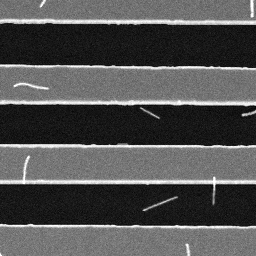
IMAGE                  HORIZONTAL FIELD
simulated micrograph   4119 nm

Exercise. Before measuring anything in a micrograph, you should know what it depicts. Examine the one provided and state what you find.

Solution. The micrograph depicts lines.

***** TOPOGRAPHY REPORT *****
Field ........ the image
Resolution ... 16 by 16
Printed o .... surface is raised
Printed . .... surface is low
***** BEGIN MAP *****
oooooooooooooooo
................
................
................
oooooooooooooooo
oooooooooooooooo
.......oo.oooooo
................
................
oooooooooooooooo
oooooooooooooooo
................
................
................
oooooooooooooooo
oooooooooooooooo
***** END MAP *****